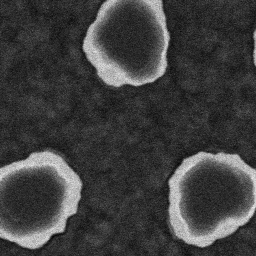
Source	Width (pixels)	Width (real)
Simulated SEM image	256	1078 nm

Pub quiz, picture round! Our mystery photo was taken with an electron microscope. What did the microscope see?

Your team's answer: raised bodies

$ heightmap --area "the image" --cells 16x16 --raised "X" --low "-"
-------XXX------
------XXXX------
-----XXXXX------
------XXXX------
-------XXX------
----------------
----------------
----------------
----------------
----------------
XXXX-------XXXXX
XXXXX------XXXXX
XXXXX------XXXXX
XXXX-------XXXXX
XXX--------XXX--
----------------